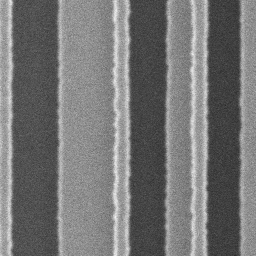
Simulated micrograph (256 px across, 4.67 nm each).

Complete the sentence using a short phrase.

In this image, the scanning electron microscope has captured lines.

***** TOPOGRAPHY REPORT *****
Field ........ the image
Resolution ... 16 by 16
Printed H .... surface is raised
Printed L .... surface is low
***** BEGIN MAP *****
HLLLHHHHLLHHHLLH
HLLLHHHHLLHHHLLH
HLLLHHHHLLHHHLLH
HLLLHHHHLLHHHLLH
HLLLHHHHLLHHHLLH
HLLLHHHHLLHHHLLH
HLLLHHHHLLHHHLLH
HLLLHHHHLLHHHLLH
HLLLHHHHLLHHHLLH
HLLLHHHHLLHHHLLH
HLLLHHHHLLHHHLLH
HLLLHHHHLLHHHLLH
HLLLHHHHLLHHHLLH
HLLLHHHHLLHHHLLH
HLLLHHHHLLHHHLLH
HLLLHHHHLLHHHLLH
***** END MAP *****